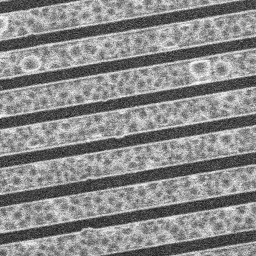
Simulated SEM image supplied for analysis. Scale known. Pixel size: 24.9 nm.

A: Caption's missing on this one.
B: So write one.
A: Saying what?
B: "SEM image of parallel lines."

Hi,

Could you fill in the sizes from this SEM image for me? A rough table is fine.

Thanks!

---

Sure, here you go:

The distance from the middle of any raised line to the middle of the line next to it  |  946 nm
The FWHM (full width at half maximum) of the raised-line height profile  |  25.5 pixels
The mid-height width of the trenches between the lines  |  316 nm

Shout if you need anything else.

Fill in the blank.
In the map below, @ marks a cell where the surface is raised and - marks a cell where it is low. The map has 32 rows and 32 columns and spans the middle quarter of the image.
@@--------------------@@@@@@@@@@
----------------@@@@@@@@@@@@@@@@
---------@@@@@@@@@@@@@@@@@@@@@@@
----@@@@@@@@@@@@@@@@@@@@@@@@@@@@
@@@@@@@@@@@@@@@@@@@@@@@@@@@@@@@@
@@@@@@@@@@@@@@@@@@@@@@@@@@@@@@--
@@@@@@@@@@@@@@@@@@@@@@@@--------
@@@@@@@@@@@@@@@@@@--------------
@@@@@@@@@@@@--------------------
@@@@@@--------------------@@@@@@
--------------------@@@@@@@@@@@@
--------------@@@@@@@@@@@@@@@@@@
---------@@@@@@@@@@@@@@@@@@@@@@@
---@@@@@@@@@@@@@@@@@@@@@@@@@@@@@
@@@@@@@@@@@@@@@@@@@@@@@@@@@@@@@@
@@@@@@@@@@@@@@@@@@@@@@@@@@@@----
@@@@@@@@@@@@@@@@@@@@@@----------
@@@@@@@@@@@@@@@@----------------
@@@@@@@@@@@-------------------@@
@@@@@--------------------@@@@@@@
-------------------@@@@@@@@@@@@@
-------------@@@@@@@@@@@@@@@@@@@
-------@@@@@@@@@@@@@@@@@@@@@@@@@
-@@@@@@@@@@@@@@@@@@@@@@@@@@@@@@@
@@@@@@@@@@@@@@@@@@@@@@@@@@@@@@@-
@@@@@@@@@@@@@@@@@@@@@@@@@-------
@@@@@@@@@@@@@@@@@@@-------------
@@@@@@@@@@@@@-------------------
@@@@@@@----------------------@@@
@----------------------@@@@@@@@@
-----------------@@@@@@@@@@@@@@@
-----------@@@@@@@@@@@@@@@@@@@@@